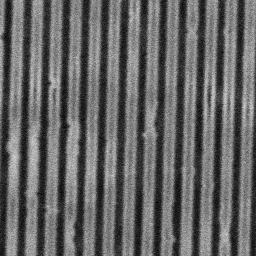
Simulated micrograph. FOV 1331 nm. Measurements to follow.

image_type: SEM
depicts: parallel lines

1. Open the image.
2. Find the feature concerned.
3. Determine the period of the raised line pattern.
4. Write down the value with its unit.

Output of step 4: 101 nm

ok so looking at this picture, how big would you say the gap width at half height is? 48.1 nanometres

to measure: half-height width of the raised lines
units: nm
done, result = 52